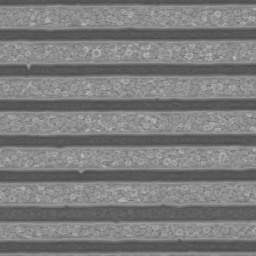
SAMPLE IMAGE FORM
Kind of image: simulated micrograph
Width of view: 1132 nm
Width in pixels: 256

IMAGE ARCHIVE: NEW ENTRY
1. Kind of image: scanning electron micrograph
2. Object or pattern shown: parallel lines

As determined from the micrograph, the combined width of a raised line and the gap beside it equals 35.7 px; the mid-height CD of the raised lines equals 106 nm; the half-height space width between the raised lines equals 50.8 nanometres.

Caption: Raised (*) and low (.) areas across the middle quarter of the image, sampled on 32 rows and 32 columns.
................................
................................
................................
********************************
********************************
********************************
********************************
********************************
********************************
................................
................................
................................
********************************
********************************
********************************
********************************
********************************
*********.**********************
................................
................................
......................*....****.
********************************
********************************
********************************
********************************
********************************
************....................
................................
................................
.**...*************...***.......
********************************
********************************